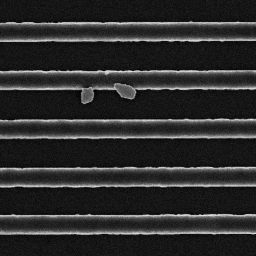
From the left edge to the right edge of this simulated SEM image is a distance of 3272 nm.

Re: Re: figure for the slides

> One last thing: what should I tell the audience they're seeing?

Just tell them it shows lines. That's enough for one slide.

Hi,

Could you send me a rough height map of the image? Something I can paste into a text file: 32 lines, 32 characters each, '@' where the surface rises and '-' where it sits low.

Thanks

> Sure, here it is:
--------------------------------
--------------------------------
--------------------------------
@@@@@@@@@@@@@@@@@@@@@@@@@@@@@@@@
@@@@@@@@@@@@@@@@@@@@@@@@@@@@@@@@
--------------------------------
--------------------------------
--------------------------------
--------------------------------
@@@@@@@@@@@@@@@@@@@@@@@@@@@@@@@@
@@@@@@@@@@@@@@@@@@@@@@@@@@@@@@@@
----------@@---@@---------------
----------@---------------------
--------------------------------
--------------------------------
@@@@@@@@@@@@@@@@@@@@@@@@@@@@@@@@
@@@@@@@@@@@@@@@@@@@@@@@@@@@@@@@@
--------------------------------
--------------------------------
--------------------------------
--------------------------------
@@@@@@@@@@@@@@@@@@@@@@@@@@@@@@@@
@@@@@@@@@@@@@@@@@@@@@@@@@@@@@@@@
--------------------------------
--------------------------------
--------------------------------
--------------------------------
@@@@@@@@@@@@@@@@@@@@@@@@@@@@@@@@
@@@@@@@@@@@@@@@@@@@@@@@@@@@@@@@@
--------------------------------
--------------------------------
--------------------------------